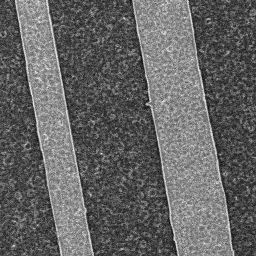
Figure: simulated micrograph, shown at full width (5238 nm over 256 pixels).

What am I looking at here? one or a few lines or trenches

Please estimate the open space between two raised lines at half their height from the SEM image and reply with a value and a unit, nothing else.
1720 nm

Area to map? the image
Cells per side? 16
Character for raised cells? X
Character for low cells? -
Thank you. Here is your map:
-XX-----XXXX----
-XX------XXX----
-XX------XXX----
--XX-----XXX----
--XX-----XXX----
--XX-----XXXX---
--XX-----XXXX---
--XX------XXX---
--XX------XXX---
---XX-----XXX---
---XX-----XXXX--
---XX-----XXXX--
---XX------XXX--
---XX------XXX--
----XX-----XXX--
----XX-----XXX--